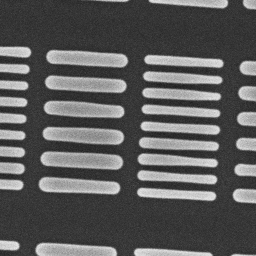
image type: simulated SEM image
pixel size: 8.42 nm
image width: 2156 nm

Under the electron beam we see groups of lines, slits or small figures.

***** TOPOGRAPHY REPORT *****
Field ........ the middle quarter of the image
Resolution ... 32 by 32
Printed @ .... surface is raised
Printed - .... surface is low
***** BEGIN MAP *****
----------@@@@@-----------------
--------------------------------
--------------------@@@@@@@@@@--
@@@@@@@-------------@@@@@@@@@@@@
@@@@@@@@@@@@@@@----------@@@@@@@
@@@@@@@@@@@@@@@-----------------
-@@@@@@@@@@@@@@-----@@@@@@@@@---
--------------------@@@@@@@@@@@@
-----------------------@@@@@@@@@
@@@-----------------------------
@@@@@@@@@@@@--------@@@---------
@@@@@@@@@@@@@@@-----@@@@@@@@@@@@
@@@@@@@@@@@@@@@---------@@@@@@@@
--------------------------------
--------------------------------
-------------------@@@@@@@@@@@@@
@@@@@@@@@@@---------@@@@@@@@@@@@
@@@@@@@@@@@@@@@-----------------
@@@@@@@@@@@@@@@-----------------
----@@@@@@@@@@-----@@@@@@@@@@@@@
-------------------@@@@@@@@@@@@@
--------------------------------
@@@@@@--------------------------
@@@@@@@@@@@@@@-----@@@@@@@@@@@@@
@@@@@@@@@@@@@@@----@@@@@@@@@@@@@
@@@@@@@@@@@@@@------------------
--------------------------------
-------------------@@@@@@@@@----
-------------------@@@@@@@@@@@@@
@@@@@@@@@@@---------------------
@@@@@@@@@@@@@@------------------
@@@@@@@@@@@@@@-----@@@@@@@------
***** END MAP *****